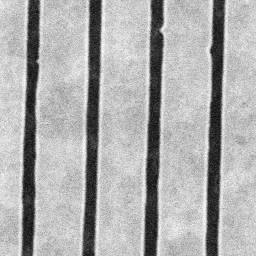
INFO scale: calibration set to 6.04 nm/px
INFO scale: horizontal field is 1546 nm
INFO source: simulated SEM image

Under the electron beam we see one or a few lines or trenches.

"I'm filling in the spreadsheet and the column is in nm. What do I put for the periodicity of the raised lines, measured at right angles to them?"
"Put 372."